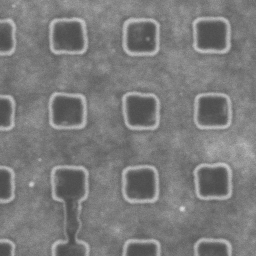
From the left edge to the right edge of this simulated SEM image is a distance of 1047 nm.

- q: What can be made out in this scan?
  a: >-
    a regular array of raised bodies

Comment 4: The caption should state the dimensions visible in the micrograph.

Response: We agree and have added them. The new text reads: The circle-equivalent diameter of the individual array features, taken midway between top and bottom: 155 nm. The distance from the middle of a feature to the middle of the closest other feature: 292 nanometers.